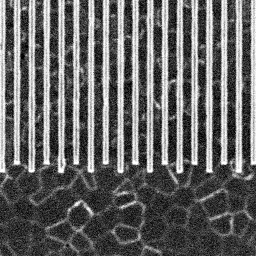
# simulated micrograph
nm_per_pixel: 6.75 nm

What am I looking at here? parallel lines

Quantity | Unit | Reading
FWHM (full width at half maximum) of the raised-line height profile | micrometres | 0.0287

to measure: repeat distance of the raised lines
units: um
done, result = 0.0997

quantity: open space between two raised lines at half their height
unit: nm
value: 73.4